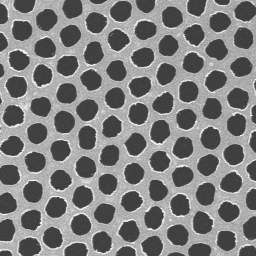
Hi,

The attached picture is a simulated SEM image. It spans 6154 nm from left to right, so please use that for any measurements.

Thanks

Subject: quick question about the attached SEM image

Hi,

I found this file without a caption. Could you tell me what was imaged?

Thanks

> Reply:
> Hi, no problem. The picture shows a regular array of holes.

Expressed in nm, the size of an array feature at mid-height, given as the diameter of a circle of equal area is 503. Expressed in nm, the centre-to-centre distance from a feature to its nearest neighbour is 656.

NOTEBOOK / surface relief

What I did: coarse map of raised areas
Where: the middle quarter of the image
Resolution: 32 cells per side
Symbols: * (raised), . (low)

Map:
....*******....***...***...***..
...***.***......*******.....**..
..**.....**.....*******.....****
****.....***...***...**....*****
****.....********.....**...***..
...**....*******......*******...
...***..***...***....********...
...*******.....**....****..**...
...*******.....********....**...
..**....**.....*******.....***..
***.....***....**....*.....*****
***.....********.....**....**...
..*.....********.....*******....
...*...****..***.....*******....
...*******....***...***...**....
..***.****....********....***...
..**....**....********....****.*
****....**...****..***.....*****
****....********....**....***..*
.***....*******......**..***....
.***....***..**......******.....
..********....**....*******.....
.********.....**...***....*.....
.***...**.....********....***.**
***.....*....********.....******
***.....***.****...***....******
***.....*******.....**...***....
.**.....**..***.....*******.....
..***.***....**.....*******.....
..*******....***...***...**.....
.***.****....********....***..**
***....**....********.....******